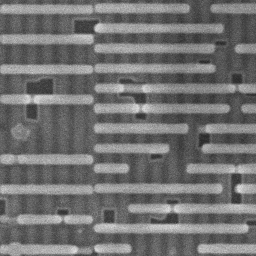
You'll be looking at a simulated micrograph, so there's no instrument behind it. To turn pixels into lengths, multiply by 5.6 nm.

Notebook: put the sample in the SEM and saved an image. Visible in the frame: wiring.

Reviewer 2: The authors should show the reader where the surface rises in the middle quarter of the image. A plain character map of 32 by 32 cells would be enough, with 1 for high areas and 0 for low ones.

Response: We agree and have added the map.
11111100111111111111111111111111
11111110111111111111111111111111
00000000000000000000000000000000
00000000000000000000000000000000
00000000000000000000000000000000
00000000111111100000111111111111
00000000111111100000111111111111
00000000000000000000000000000000
11111110000000000000000000000000
11111110000000000000000000000000
00000000111111111110111111111111
00000000111111111110111111111111
00000000000000000000000000000000
00000000000000000000000000000000
00000000000000000000000000000000
00000000111111111111111111111110
00000000111111111111111111111110
00000000000000000000000000000000
00000000000000000000000000000000
00000000000000000000000000000000
00000000111111111111111111000000
00000000111111111111111111000000
00000000000000000000000000000000
11111110000000000000000000000000
11111110000000000000000000000000
00000000111111110000000000000001
00000000111111110000000000000001
00000000000000000000000000000000
00000000000000000000000000000000
00000000000000000000000000000000
11111110111111111111111111111111
11111110111111111111111111111111